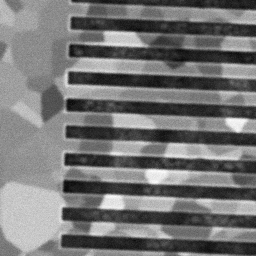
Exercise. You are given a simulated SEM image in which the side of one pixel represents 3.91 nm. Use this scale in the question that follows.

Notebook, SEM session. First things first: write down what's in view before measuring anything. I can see parallel lines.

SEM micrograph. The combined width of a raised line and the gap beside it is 106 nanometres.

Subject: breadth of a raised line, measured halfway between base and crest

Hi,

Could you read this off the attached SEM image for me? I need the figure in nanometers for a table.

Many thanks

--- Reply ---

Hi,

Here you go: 50.8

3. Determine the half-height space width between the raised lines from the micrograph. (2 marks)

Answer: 57.1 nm